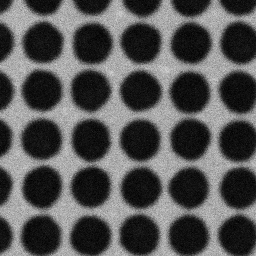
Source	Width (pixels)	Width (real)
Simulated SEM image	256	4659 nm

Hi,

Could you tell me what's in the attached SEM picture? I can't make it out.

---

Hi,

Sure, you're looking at a regular array of holes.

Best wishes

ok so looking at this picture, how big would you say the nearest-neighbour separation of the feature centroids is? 869 nm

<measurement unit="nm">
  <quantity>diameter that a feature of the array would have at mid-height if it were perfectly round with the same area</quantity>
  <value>758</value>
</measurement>